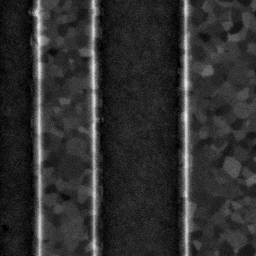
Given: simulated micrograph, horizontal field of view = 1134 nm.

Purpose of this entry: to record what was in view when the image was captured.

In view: one or a few lines or trenches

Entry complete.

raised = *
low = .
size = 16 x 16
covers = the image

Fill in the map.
..****......****
..****......****
..****......****
..****......****
..****......****
..****......****
..****......****
..****......****
..****......****
..****......****
..****......****
..****......****
..****......****
..****......****
..****......****
..****......****